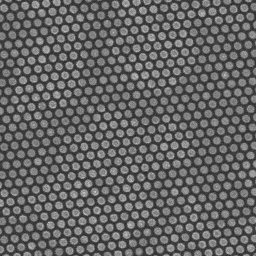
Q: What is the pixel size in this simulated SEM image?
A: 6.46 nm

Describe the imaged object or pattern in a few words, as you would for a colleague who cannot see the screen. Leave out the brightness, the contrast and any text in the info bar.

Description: a regular array of raised bodies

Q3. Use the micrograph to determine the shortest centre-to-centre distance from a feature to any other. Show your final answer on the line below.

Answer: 66.5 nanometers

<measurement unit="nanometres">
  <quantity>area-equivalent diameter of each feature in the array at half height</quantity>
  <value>48.3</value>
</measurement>